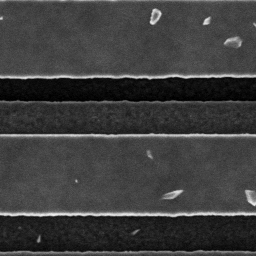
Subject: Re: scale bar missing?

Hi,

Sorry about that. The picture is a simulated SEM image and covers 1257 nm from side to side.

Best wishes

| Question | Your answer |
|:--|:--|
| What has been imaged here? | lines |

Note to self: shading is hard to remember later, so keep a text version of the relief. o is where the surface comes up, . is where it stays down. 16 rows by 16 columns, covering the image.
oooooooooooooooo
oooooooooooooooo
oooooooooooooooo
oooooooooooooooo
oooooooooooooooo
................
................
................
oooooooooooooooo
oooooooooooooooo
oooooooooooooooo
oooooooooooooooo
oooooooooooooooo
..........o.....
................
................